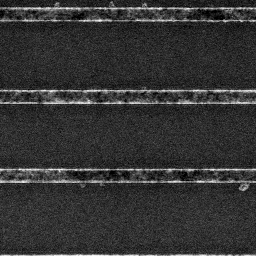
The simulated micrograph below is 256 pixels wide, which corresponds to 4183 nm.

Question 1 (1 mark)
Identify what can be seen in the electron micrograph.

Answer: lines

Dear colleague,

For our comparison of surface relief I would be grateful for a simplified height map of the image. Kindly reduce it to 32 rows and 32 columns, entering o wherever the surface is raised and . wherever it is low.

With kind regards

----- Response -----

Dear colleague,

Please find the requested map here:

................................
oooooooooooooooooooooooooooooooo
oooooooooooooooooooooooooooooooo
................................
................................
................................
................................
................................
................................
................................
................................
oooooooooooooooooooooooooooooooo
oooooooooooooooooooooooooooooooo
................................
................................
................................
................................
................................
................................
................................
................................
oooooooooooooooooooooooooooooooo
oooooooooooooooooooooooooooooooo
................................
................................
................................
................................
................................
................................
................................
................................
................................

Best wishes